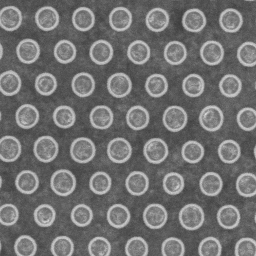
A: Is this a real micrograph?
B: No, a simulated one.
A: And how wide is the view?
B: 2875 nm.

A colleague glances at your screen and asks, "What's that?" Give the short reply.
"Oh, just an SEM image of a regular array of raised bodies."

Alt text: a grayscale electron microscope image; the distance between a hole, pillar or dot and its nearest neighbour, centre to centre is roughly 0.411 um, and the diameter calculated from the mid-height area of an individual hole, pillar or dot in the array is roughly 0.243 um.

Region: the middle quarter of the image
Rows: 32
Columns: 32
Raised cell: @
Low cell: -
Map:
--------------------------------
--------------------------------
--------------------------------
---@@@@-----@@@@-----@@@@------@
--@@@@@----@@@@@@----@@@@-----@@
--@@@@@----@@@@@@----@@@@@----@@
--@@@@@----@@@@@-----@@@@-----@@
---@@@------@@@@------@@-------@
--------------------------------
--------------------------------
--------------------------------
@@-----@@@@------@@@------@@@@--
@@-----@@@@@----@@@@@----@@@@@--
@@-----@@@@@----@@@@@----@@@@@--
@@-----@@@@@----@@@@@----@@@@@--
@-------@@@------@@@------@@@@--
----------------------------@---
--------------------------------
--------------------------------
---@@@@-----@@@@-----@@@@------@
--@@@@@----@@@@@----@@@@@-----@@
--@@@@@@---@@@@@@---@@@@@@----@@
--@@@@@@---@@@@@@---@@@@@@----@@
---@@@@-----@@@@-----@@@@-----@@
----------------------@@--------
--------------------------------
--------------------------------
@@------@@-------@@@-------@----
@@-----@@@@-----@@@@@----@@@@---
@@-----@@@@@----@@@@@----@@@@@--
@@-----@@@@-----@@@@@----@@@@@--
@@-----@@@@-----@@@@------@@@---